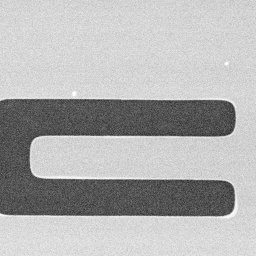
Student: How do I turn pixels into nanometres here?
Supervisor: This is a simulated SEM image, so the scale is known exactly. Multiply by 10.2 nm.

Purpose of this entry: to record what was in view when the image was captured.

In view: groups of lines, slits or small figures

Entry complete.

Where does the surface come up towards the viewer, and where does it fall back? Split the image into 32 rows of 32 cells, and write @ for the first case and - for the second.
@@@@@@@@@@@@@@@@@@@@@@@@@@@@@@@@
@@@@@@@@@@@@@@@@@@@@@@@@@@@@@@@@
@@@@@@@@@@@@@@@@@@@@@@@@@@@@@@@@
@@@@@@@@@@@@@@@@@@@@@@@@@@@@@@@@
@@@@@@@@@@@@@@@@@@@@@@@@@@@@@@@@
@@@@@@@@@@@@@@@@@@@@@@@@@@@@@@@@
@@@@@@@@@@@@@@@@@@@@@@@@@@@@@@@@
@@@@@@@@@@@@@@@@@@@@@@@@@@@@@@@@
@@@@@@@@@@@@@@@@@@@@@@@@@@@@@@@@
@@@@@@@@@@@@@@@@@@@@@@@@@@@@@@@@
@@@@@@@@@@@@@@@@@@@@@@@@@@@@@@@@
@@@@@@@@@@@@@@@@@@@@@@@@@@@@@@@@
----------------------------@@@@
-----------------------------@@@
------------------------------@@
-----------------------------@@@
-----------------------------@@@
----@@@@@@@@@@@@@@@@@@@@@@@@@@@@
----@@@@@@@@@@@@@@@@@@@@@@@@@@@@
----@@@@@@@@@@@@@@@@@@@@@@@@@@@@
----@@@@@@@@@@@@@@@@@@@@@@@@@@@@
----@@@@@@@@@@@@@@@@@@@@@@@@@@@@
----------------------------@@@@
-----------------------------@@@
-----------------------------@@@
-----------------------------@@@
-----------------------------@@@
@@@@@@@@@@@@@@@@@@@@@@@@@@@@@@@@
@@@@@@@@@@@@@@@@@@@@@@@@@@@@@@@@
@@@@@@@@@@@@@@@@@@@@@@@@@@@@@@@@
@@@@@@@@@@@@@@@@@@@@@@@@@@@@@@@@
@@@@@@@@@@@@@@@@@@@@@@@@@@@@@@@@